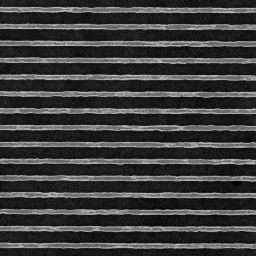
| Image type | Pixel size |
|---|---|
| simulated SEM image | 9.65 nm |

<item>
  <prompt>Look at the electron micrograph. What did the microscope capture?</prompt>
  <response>parallel lines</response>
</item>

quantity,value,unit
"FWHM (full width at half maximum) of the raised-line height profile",0.0434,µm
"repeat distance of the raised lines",162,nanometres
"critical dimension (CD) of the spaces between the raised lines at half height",0.121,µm